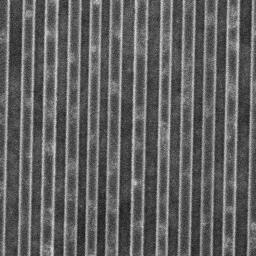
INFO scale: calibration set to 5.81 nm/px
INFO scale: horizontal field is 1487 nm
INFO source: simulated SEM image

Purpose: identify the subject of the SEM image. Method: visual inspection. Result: parallel lines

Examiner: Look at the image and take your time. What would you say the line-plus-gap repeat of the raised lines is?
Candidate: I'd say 0.132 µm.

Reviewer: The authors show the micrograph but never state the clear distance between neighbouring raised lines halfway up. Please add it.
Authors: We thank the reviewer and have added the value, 66.8 nm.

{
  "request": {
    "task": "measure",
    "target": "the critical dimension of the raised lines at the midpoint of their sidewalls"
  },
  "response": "0.0668 microns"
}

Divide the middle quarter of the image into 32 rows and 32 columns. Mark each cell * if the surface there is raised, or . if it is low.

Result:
.***..***..***....***...***...**
.***..***..***....***...**....**
.***..***..***....**....**....**
.***..***..***....**....**....**
.***..***..***....**....**....**
.***..***..***....**....**....**
.***..***..***....**....**...***
.***..***..***....**....**...***
.***..***..***....**....**...***
.***..***..***...***....**...***
.***..***..***...***....**...***
.***..***..***...***....**...***
.***..***..***...***....**...***
.***..***..***...***....**...***
.***..***..***...***....**...***
.***..***..***...***....**...***
.**...***..***...***....**...***
.**...**...***...***....**...***
.**...**...***...***....**...***
.**...**...***...***....**...***
.**...**...***...***....**...***
.**...**...***...***....**...***
.**...**...***...***....**...***
.**...**...***...***....**...***
.**...**...***...***....**...***
.**...**...***...***....**...***
.**...**...***...***....**...***
.**...**...***...***....**...***
.**...**...***...***....**...***
.**...**...***...***....**...***
.**...**...***...***....**...***
.**...**...**....***...***...***